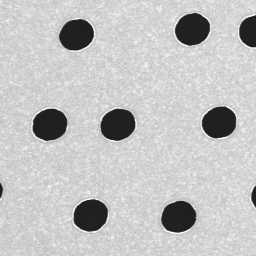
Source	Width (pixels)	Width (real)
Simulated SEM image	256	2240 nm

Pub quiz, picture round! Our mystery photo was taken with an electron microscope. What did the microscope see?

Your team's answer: holes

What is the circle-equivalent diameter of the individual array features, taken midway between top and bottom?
294 nanometres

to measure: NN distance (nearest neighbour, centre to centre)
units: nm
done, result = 772